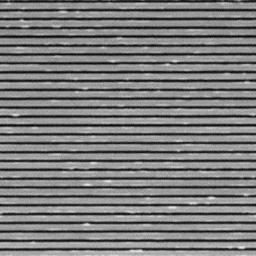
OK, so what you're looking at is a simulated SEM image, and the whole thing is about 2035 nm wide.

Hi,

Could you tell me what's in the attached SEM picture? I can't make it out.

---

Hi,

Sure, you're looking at parallel lines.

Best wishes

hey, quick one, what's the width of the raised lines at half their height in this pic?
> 51.7 nm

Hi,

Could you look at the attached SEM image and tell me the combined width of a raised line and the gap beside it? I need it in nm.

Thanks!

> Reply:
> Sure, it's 70.5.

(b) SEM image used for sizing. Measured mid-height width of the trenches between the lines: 0.0219 microns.